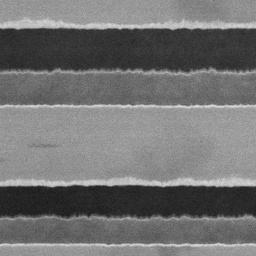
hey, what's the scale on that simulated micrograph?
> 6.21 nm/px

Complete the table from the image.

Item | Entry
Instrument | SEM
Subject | lines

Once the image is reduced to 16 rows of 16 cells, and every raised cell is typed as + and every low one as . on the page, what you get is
++++++++++++++++
++++++++++++++++
................
................
...+..+++...++..
++++++++++++++++
++++++++++++++++
++++++++++++++++
++++++++++++++++
++++++++++++++++
++++++++++++++++
++++++++++++++++
................
................
++++++++++++++++
++++++++++++++++